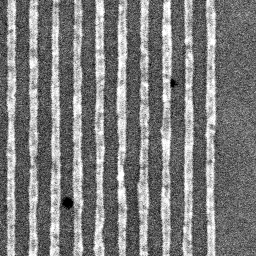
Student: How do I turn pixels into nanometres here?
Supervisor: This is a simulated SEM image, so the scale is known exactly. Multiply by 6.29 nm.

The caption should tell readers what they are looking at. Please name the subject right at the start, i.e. parallel lines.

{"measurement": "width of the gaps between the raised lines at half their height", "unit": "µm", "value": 0.0974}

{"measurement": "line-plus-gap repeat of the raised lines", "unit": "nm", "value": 139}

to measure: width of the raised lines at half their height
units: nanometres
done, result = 42.4